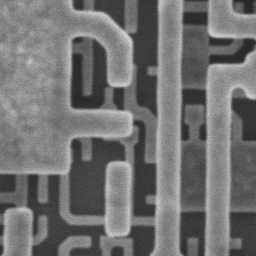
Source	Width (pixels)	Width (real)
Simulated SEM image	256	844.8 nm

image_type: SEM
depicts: wiring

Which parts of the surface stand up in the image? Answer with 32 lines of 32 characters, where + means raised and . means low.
+++++++++...........+++...+++...
++++++++++++........+++...+++...
++++++++++++++......+++...++++++
+++++++++++++++.....+++...++++++
++++++++++.+++++....+++....+++++
+++++++++....+++....+++.........
+++++++++....+++....+++.........
+++++++++....+++....+++........+
+++++++++....+++....++....++++++
+++++++++....+++....++....++++++
+++++++++.....++....+++...++++++
+++++++++...........+++...+++..+
+++++++++...........+++...+++...
+++++++++...........+++...+++...
++++++++++++++++....+++...+++...
++++++++++++++++....++....+++...
++++++++++++++++....++....+++...
+++++++++...........++....+++...
+++++++++...........++....+++...
+++++++++...........++....+++...
+++++++++.....++....++....+++...
++++++++.....+++....++....+++...
.............+++....++....+++...
.............+++....++....+++...
.............+++....++....+++...
.............+++....++....+++...
.+++.........+++...+++....+++...
.+++.........+++...+++....+++...
.+++.........+++...+++....+++...
.+++...............+++....+++...
.+++...............+++....+++...
++++...............+++....+++...